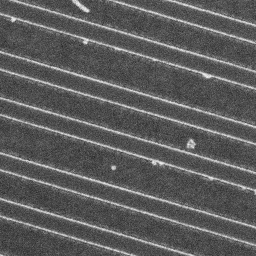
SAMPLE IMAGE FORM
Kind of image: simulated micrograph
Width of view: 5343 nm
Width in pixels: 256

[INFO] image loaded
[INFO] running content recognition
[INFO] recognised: lines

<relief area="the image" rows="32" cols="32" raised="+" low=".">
+++............++++++++.........
+++++++............++++++++.....
..++++++++............++++++++..
......++++++++...........+++++++
.........++++++++............+++
.............+++++++............
................++++++++........
++++...............++++++++.....
+++++++................++++++++.
...+++++++................++++++
......++++++++................++
.........++++++++...............
+............++++++++...........
++++............++++++++........
++++++++............+++++++.....
....+++++++............++++++++.
.......++++++++............+++++
..........++++++++............++
..............+++++++...........
++...............++++++++.......
+++++...............++++++++....
.+++++++................++++++++
....++++++++...............+++++
........+++++++................+
...........++++++++.............
++............++++++++..........
++++++............++++++++......
.++++++++............++++++++...
.....+++++++............++++++++
........++++++++............++++
............+++++++............+
...............++++++++.........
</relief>